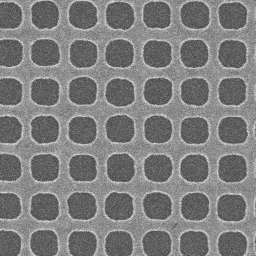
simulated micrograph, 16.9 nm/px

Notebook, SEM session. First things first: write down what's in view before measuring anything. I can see a regular array of holes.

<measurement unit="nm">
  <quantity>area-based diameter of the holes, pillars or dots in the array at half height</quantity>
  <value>506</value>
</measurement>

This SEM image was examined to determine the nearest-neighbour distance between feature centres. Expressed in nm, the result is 630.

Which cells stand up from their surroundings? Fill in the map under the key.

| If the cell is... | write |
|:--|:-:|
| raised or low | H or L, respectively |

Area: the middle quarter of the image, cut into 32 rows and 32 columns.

HHLLLLLHHHHHLLLLLHHHHLLLLLHHHHLL
HHHHHHHHHHHHHHHHHHHHHHHHHHHHHHHH
HHHHHHHHHHHHHHHHHHHHHHHHHHHHHHHH
HHHLLLLHHHHHHLHHHHHHHHLLLHHHHHHH
HLLLLLLLHHHLLLLLLHHHLLLLLLLHHHLL
HLLLLLLLHHHLLLLLLHHHLLLLLLLHHLLL
HLLLLLLLHHLLLLLLLLHHLLLLLLLHHLLL
HLLLLLLLHHLLLLLLLLHHLLLLLLLHHLLL
HLLLLLLLHHLLLLLLLLHHLLLLLLLHHLLL
HHLLLLLLHHHLLLLLLHHHHLLLLLHHHHLL
HHHHHHHHHHHHLLLLHHHHHHHHHHHHHHHH
HHHHHHHHHHHHHHHHHHHHHHHHHHHHHHHH
HHHHHHHHHHHHHHHHHHHHHHHHHHHHHHHH
HHLLLLLHHHHLLLLLLHHHHLLLLLHHHHHL
HLLLLLLLHHLLLLLLLHHHLLLLLLLHHLLL
HLLLLLLLHHLLLLLLLLHHLLLLLLLHHLLL
HLLLLLLLHHLLLLLLLLHHLLLLLLLHHLLL
HLLLLLLLHHLLLLLLLLHHLLLLLLLHHLLL
HLLLLLLLHHHLLLLLLHHHLLLLLLLHHLLL
HHLLLLLHHHHHLLLLHHHHHLLLLLHHHHLL
HHHHHHHHHHHHHHHHHHHHHHHHHHHHHHHH
HHHHHHHHHHHHHHHHHHHHHHHHHHHHHHHH
HHHHHHHHHHHHLLLLHHHHHHHHHHHHHHHH
HHLLLLLLHHHLLLLLLHHHHLLLLLHHHHLL
HLLLLLLLHHHLLLLLLLHHLLLLLLLHHLLL
HLLLLLLLHHHLLLLLLLHHLLLLLLLHHLLL
HLLLLLLLHHHLLLLLLLHHLLLLLLLHHLLL
HLLLLLLLHHHLLLLLLLHHLLLLLLLHHLLL
HHLLLLLLHHHLLLLLLHHHHLLLLLHHHHLL
HHHHHHHHHHHHHLLLHHHHHHLLLHHHHHHL
HHHHHHHHHHHHHHHHHHHHHHHHHHHHHHHH
HHHHHHHHHHHHHHHHHHHHHHHHHHHHHHHH